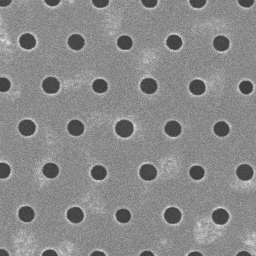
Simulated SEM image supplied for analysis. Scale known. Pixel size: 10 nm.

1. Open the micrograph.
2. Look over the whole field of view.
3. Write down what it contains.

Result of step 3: a regular array of holes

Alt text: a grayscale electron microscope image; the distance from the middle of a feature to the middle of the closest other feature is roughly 482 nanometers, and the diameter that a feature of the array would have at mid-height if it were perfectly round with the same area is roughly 0.166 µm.